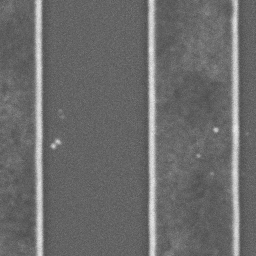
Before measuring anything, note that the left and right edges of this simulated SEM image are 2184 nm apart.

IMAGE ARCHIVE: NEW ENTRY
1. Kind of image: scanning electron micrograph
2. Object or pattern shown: wiring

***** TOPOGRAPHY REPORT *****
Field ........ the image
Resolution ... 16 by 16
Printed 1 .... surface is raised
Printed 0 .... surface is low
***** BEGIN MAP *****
1100000001111110
1100000001111110
1100000001111110
1100000001111110
1100000001111110
1100000001111110
1100000001111110
1100000001111110
1100000001111110
1100000001111110
1100000001111110
1100000000111110
1100000000111110
1100000001111110
1100000000111110
1100000000111110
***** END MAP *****